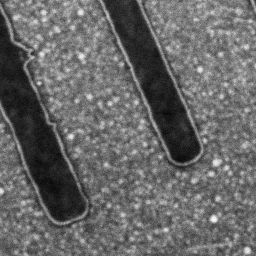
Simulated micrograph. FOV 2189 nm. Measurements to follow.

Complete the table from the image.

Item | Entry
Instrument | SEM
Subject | one or a few lines or trenches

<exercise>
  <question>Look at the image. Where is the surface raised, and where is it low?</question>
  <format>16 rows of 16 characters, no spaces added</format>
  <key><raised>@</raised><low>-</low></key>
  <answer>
------@@@-------
@------@@-------
@------@@@------
@@------@@------
@@------@@@-----
@@-------@@-----
@@@------@@@----
@@@------@@@----
-@@@------@@----
-@@@------@@@---
--@@------------
--@@@-----------
---@@-----------
---@@-----------
----------------
----------------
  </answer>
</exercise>